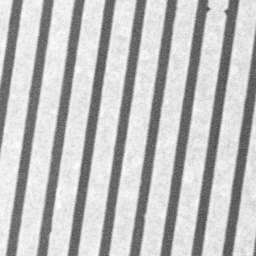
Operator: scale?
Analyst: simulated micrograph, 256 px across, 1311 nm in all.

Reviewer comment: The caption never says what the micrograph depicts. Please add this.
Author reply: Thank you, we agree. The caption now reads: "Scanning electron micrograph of parallel lines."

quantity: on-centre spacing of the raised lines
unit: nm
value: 157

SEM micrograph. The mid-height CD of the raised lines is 101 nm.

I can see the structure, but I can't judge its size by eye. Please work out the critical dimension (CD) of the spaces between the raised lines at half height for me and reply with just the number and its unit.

57.1 nm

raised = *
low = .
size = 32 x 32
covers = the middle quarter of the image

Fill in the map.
...*****...*****..*****...*****.
...*****...****...*****...*****.
...****...*****...*****...*****.
..*****...*****...*****...*****.
..*****...*****...*****...****..
..*****...*****...****...*****..
..*****...*****...****...*****..
..*****...*****..*****...*****..
..*****...****...*****...*****..
..****...*****...*****...****...
.*****...*****...*****...****...
.*****...*****...*****..*****...
.*****...*****...****...*****...
.*****...*****..*****...*****...
.*****...****...*****...*****...
.*****..*****...*****...*****...
.****...*****...*****...*****...
*****...*****...*****...****...*
*****...*****...****...*****...*
*****...*****..*****...*****...*
*****...*****..*****...*****...*
*****...****...*****...*****...*
****...*****...*****...*****...*
****...*****...*****...*****...*
****...*****...*****...****...**
****...*****...****...*****...**
****...*****..*****...*****...**
****...*****..*****...*****...**
****..*****...*****...*****...**
***...*****...*****...*****...**
***...*****...*****...*****..***
***...*****...*****...****...***